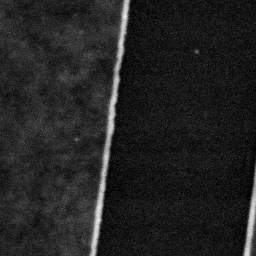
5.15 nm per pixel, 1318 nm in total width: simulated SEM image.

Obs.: one or a few lines or trenches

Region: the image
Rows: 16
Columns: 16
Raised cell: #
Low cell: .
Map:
########........
########........
########........
########........
#######.........
#######.........
#######.........
#######.........
#######.........
#######.........
#######.........
######..........
######..........
######..........
######..........
######.........#